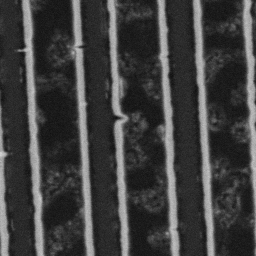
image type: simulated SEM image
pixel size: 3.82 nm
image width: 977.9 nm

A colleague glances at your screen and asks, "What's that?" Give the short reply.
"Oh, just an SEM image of one or a few lines or trenches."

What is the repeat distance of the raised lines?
325 nanometers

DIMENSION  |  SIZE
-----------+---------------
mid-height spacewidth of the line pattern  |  125 nm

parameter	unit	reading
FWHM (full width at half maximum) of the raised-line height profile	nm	201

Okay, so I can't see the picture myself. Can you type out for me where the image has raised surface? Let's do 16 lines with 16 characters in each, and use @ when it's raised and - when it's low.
--@@@--@@@--@@@@
--@@@--@@@--@@@@
--@@@--@@@--@@@@
--@@@--@@@--@@@@
--@@@--@@@--@@@@
--@@@--@@@---@@@
--@@@--@@@@--@@@
--@@@--@@@@--@@@
--@@@--@@@@--@@@
--@@@--@@@@--@@@
--@@@--@@@@--@@@
--@@@---@@@--@@@
--@@@@--@@@--@@@
--@@@@--@@@--@@@
--@@@@--@@@--@@@
--@@@@--@@@--@@@